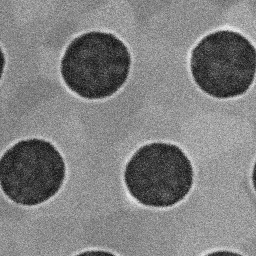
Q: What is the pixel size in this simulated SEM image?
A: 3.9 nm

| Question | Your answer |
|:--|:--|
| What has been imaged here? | holes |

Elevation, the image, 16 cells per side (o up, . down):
oooooooooooooooo
oooooooooooooooo
ooooo..oooooo...
oooo....oooo....
oooo....oooo....
oooo...oooooo...
oooooooooooooooo
oooooooooooooooo
oooooooooooooooo
....oooo...ooooo
....oooo....oooo
....oooo....oooo
o..ooooo...ooooo
oooooooooooooooo
oooooooooooooooo
oooooooooooooooo